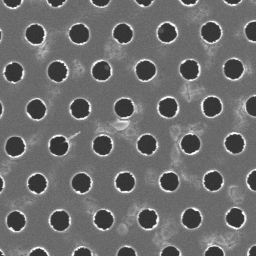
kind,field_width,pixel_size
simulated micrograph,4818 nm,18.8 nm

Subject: a regular array of holes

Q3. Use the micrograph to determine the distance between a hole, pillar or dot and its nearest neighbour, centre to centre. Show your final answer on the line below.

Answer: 810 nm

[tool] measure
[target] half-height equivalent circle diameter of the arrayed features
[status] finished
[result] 0.362 µm